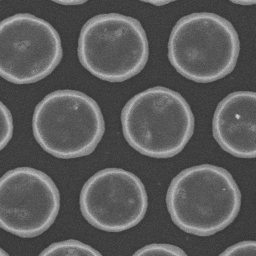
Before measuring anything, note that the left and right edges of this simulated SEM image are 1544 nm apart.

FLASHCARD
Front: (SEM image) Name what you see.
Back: raised bodies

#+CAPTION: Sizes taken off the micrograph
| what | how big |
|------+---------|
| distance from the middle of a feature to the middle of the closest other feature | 532 nm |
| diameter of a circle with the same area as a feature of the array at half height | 396 nanometers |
